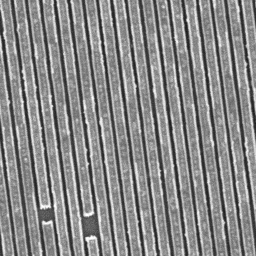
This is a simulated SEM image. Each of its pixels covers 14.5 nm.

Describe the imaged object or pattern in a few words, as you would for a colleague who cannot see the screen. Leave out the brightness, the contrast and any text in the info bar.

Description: parallel lines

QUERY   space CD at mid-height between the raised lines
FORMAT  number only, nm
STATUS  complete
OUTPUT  70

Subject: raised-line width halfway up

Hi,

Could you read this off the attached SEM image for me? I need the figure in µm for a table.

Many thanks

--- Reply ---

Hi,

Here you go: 0.142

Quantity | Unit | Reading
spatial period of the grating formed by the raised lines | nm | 204